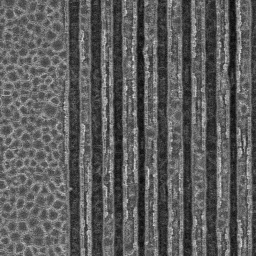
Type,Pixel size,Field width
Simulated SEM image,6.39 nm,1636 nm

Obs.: parallel lines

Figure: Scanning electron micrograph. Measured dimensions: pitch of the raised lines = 145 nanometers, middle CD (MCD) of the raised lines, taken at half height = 83.1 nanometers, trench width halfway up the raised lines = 65.5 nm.